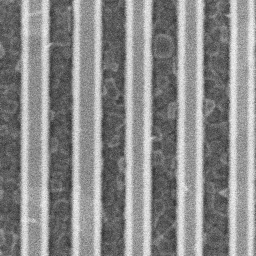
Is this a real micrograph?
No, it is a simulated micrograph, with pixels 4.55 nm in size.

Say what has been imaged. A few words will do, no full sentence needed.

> parallel lines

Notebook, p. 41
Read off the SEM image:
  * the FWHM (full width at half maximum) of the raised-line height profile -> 0.0813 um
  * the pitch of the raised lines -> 0.235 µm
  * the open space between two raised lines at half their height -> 31.7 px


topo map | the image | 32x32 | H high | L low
LLLHHHLLLLHHLLLLHHHLLLLHHLLLLHHL
LLLHHHLLLLHHLLLLHHHLLLLHHLLLLHHL
LLLHHHLLLLHHLLLLHHLLLLLHHLLLLHHL
LLLHHHLLLLHHLLLLHHLLLLLHHLLLLHHL
LLLHHHLLLLHHLLLLHHLLLLLHHLLLLHHL
LLLHHHLLLLHHLLLLHHLLLLLHHLLLLHHL
LLLHHHLLLLHHLLLLHHLLLLLHHLLLLHHL
LLLHHHLLLLHHLLLLHHLLLLLHHLLLLHHL
LLLHHHLLLLHHLLLLHHLLLLLHHLLLLHHL
LLLHHHLLLLHHLLLLHHLLLLLHHLLLLHHL
LLLHHHLLLLHHLLLLHHLLLLLHHLLLLHHL
LLLHHHLLLLHHLLLLHHLLLLLHHLLLLHHL
LLLHHHLLLLHHLLLLHHLLLLLHHLLLLHHL
LLLHHHLLLLHHLLLLHHLLLLLHHLLLLHHL
LLLHHHLLLLHHLLLLHHLLLLLHHLLLLHHL
LLLHHHLLLLHHLLLLHHLLLLLHHLLLLHHL
LLLHHHLLLLHHLLLLHHLLLLLHHLLLLHHL
LLLHHHLLLLHHLLLLHHHLLLLHHLLLLHHL
LLLHHHLLLLHHLLLLHHLLLLLHHLLLLHHL
LLLHHHLLLLHHLLLLHHLLLLLHHLLLLHHL
LLLHHHLLLLHHLLLLHHLLLLLHHLLLLHHL
LLLHHHLLLLHHLLLLHHLLLLLHHLLLLHHL
LLLHHHLLLLHHLLLLHHLLLLLHHLLLLHHL
LLLHHHLLLHHHLLLLHHLLLLLHHLLLLHHL
LLLHHHLLLLHHLLLLHHLLLLLHHLLLLHHL
LLLHHHLLLLHHLLLLHHLLLLLHHLLLLHHL
LLLHHHLLLLHHLLLLHHLLLLLHHLLLLHHL
LLLHHHLLLLHHLLLLHHLLLLLHHLLLLHHL
LLLHHHLLLLHHLLLLHHLLLLLHHLLLLHHL
LLLHHHLLLLHHLLLLHHLLLLLHHLLLLHHL
LLLHHHLLLHHHLLLLHHLLLLLHHLLLLHHL
LLLHHHLLLHHHLLLLHHLLLLLHHLLLLHHL